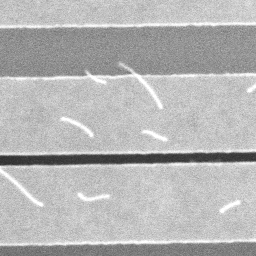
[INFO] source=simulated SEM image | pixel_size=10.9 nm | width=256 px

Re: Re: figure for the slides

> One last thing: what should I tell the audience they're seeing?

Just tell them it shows lines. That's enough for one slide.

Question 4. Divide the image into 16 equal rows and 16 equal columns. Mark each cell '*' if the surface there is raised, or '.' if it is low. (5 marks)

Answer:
****************
****************
................
................
................
****************
****************
****************
****************
***************.
****************
****************
****************
****************
****************
................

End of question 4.